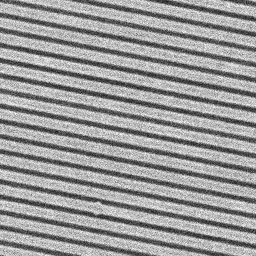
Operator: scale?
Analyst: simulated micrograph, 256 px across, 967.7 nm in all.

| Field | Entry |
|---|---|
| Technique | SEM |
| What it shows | parallel lines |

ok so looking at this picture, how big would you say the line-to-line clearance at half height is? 20.8 nm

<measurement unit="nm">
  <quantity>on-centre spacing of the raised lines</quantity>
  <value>56.2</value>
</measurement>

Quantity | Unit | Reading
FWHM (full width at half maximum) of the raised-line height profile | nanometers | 35.7